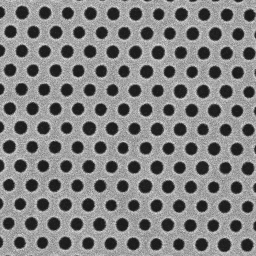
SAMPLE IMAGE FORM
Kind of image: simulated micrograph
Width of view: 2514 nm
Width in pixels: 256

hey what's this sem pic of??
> a regular array of holes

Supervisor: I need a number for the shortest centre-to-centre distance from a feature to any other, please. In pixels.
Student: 22.1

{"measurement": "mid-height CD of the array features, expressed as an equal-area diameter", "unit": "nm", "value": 129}